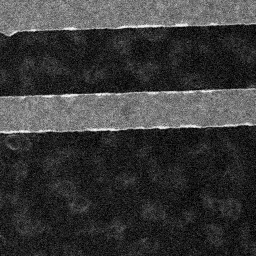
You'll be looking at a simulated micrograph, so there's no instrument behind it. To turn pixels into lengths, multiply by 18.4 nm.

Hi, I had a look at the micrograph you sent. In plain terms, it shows one or a few lines or trenches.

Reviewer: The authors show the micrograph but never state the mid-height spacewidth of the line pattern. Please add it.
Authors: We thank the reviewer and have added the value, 1200 nanometres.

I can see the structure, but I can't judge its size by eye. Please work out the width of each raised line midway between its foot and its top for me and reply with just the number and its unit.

665 nm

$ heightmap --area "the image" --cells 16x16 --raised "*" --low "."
****************
***************.
................
................
................
............*...
****************
****************
**..............
................
................
................
................
................
................
................